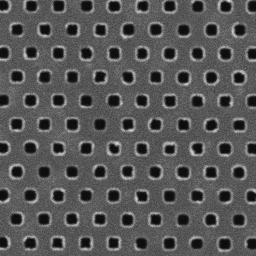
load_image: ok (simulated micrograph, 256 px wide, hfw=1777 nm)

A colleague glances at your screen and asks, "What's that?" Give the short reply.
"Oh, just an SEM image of a regular array of holes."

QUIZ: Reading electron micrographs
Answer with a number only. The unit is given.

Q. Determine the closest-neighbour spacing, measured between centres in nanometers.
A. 188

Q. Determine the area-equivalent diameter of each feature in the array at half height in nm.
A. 81.4